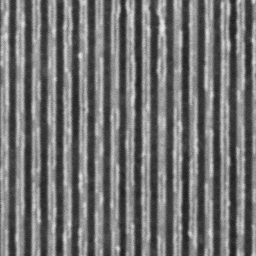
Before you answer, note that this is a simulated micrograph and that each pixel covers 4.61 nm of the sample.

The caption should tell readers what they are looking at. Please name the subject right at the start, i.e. parallel lines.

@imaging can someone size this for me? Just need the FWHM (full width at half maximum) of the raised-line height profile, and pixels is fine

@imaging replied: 7.11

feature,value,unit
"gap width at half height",36.9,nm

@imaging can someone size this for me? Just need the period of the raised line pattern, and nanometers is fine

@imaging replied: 72.6